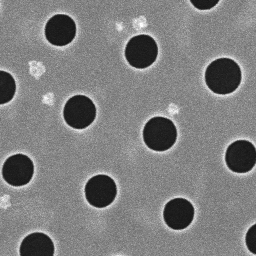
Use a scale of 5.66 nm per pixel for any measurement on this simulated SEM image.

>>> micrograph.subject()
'a regular array of holes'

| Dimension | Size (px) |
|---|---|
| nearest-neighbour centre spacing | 82.7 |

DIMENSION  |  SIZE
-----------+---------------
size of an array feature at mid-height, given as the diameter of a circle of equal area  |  33.1 px